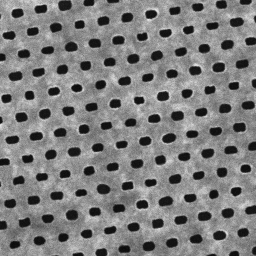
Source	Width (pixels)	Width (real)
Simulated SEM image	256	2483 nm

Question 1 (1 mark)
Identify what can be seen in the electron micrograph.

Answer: a regular array of holes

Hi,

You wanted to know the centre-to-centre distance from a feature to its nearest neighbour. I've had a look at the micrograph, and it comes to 227 nanometres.